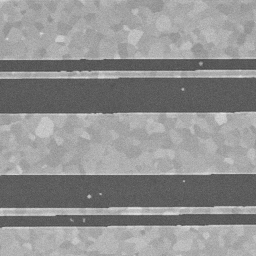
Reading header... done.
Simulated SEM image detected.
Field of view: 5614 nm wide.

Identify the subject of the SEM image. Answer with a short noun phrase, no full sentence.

lines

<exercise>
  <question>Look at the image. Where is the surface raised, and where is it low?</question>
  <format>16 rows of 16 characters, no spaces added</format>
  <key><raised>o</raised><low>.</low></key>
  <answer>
oooooooooooooooo
oooooooooooooooo
oooooooooooooooo
oooooooooooooooo
................
................
................
oooooooooooooooo
oooooooooooooooo
oooooooooooooooo
oooooooooooooooo
................
................
................
oooooooooooooooo
oooooooooooooooo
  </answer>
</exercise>